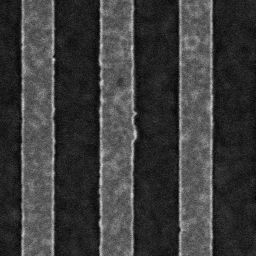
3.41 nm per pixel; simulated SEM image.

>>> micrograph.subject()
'one or a few lines or trenches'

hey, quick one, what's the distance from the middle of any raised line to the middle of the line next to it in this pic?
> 0.269 um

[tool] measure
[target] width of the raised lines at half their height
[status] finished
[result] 107 nm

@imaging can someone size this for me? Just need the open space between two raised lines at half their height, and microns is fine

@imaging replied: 0.161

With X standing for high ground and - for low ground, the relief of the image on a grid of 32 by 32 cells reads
---XXXX------XXXX------XXX------
---XXXX------XXXX------XXX------
---XXXX------XXX-------XXX------
---XXXX------XXXX------XXX------
---XXXX------XXX-------XXX------
---XXXX------XXXX------XXX------
---XXXX------XXX-------XXX------
---XXXX------XXXX------XXX------
---XXXX------XXXX------XXX------
---XXXX------XXX-------XXX------
---XXXX------XXXX------XXX------
---XXXX------XXXX------XXX------
---XXXX------XXXX------XXX------
---XXXX------XXXX------XXX------
---XXXX------XXXX------XXX------
---XXXX------XXXX------XXX------
---XXXX------XXXX------XXX------
---XXXX------XXXX------XXX------
---XXXX------XXXX------XXX------
---XXXX------XXXX------XXX------
---XXXX------XXX-------XXX------
---XXXX------XXX-------XXX------
---XXXX------XXXX-----XXXX------
---XXXX------XXX-------XXX------
---XXXX------XXX------XXXX------
---XXXX------XXX------XXXX------
---XXXX------XXXX------XXX------
---XXXX------XXXX-----XXXX------
---XXXX------XXX-------XXX------
---XXXX------XXXX-----XXXX------
---XXXX------XXX------XXXX------
---XXXX------XXXX-----XXXX------